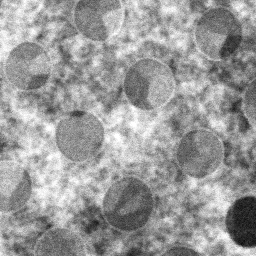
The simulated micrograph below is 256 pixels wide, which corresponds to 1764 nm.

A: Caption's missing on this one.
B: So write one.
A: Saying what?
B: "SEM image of raised bodies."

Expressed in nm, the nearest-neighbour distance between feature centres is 592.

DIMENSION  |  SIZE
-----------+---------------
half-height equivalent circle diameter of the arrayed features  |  354 nm